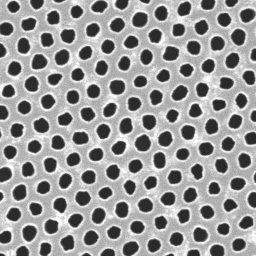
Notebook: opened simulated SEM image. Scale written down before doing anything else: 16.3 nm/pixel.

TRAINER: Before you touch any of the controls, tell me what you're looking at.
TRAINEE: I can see a regular array of holes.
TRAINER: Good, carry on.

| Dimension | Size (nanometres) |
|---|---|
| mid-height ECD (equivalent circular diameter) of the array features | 230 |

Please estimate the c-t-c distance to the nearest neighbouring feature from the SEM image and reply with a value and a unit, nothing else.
22.4 pixels